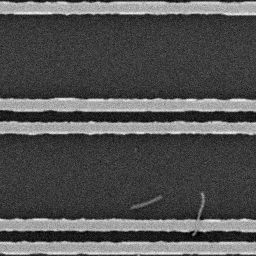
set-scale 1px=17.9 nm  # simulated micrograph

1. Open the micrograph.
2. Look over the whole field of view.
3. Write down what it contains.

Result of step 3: lines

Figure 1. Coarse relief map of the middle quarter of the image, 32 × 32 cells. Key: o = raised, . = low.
................................
................................
................................
................................
................................
................................
................................
................................
................................
oooooooooooooooooooooooooooooooo
oooooooooooooooooooooooooooooooo
ooooooooooooooooooooooooooooooo.
................................
................................
................................
oooooooooooooooooooooooooooooooo
oooooooooooooooooooooooooooooooo
................................
................................
................................
................................
................................
................................
................................
................................
................................
................................
................................
................................
................................
................................
................................